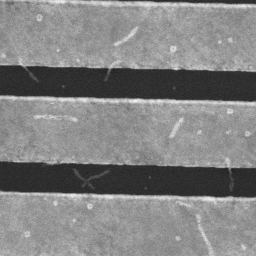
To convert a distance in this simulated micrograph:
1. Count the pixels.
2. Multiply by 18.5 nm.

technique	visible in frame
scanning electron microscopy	lines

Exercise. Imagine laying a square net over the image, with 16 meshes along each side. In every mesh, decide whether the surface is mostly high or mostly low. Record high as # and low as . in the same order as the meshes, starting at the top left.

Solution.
################
################
################
################
................
................
################
################
################
################
..............#.
................
################
################
################
################